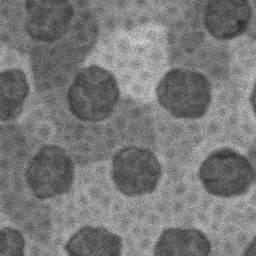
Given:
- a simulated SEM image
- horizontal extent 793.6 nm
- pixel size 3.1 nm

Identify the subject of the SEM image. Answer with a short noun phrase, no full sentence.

holes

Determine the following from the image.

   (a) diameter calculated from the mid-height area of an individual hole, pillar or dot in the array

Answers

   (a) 163 nanometers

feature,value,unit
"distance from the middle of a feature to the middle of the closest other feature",270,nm